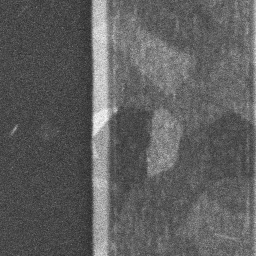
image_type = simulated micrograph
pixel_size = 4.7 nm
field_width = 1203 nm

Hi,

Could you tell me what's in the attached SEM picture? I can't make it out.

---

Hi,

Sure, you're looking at one or a few lines or trenches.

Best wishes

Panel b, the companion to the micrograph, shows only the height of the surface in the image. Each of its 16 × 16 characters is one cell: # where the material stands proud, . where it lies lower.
......##########
......##########
......##########
......##########
......##########
......##########
......##########
......##########
......##########
......##########
......##########
......##########
......##########
......##########
......##########
......##########